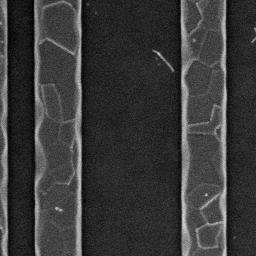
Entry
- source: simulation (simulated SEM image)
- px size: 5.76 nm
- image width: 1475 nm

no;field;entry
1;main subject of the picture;wiring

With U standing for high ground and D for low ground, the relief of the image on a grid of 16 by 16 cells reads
DDUUUDDDDDDUUUDD
DDUUUDDDDDDUUUDD
DDUUUDDDDDDUUUDD
DDUUUDDDDDDDUUDD
DDUUUDDDDDDUUUDD
DDUUUDDDDDDUUUDD
DDUUUDDDDDDDUUDD
DDUUUDDDDDDDUUDD
DDUUUDDDDDDDUUDD
DDUUUDDDDDDDUUDD
DDDUUDDDDDDDUUDD
DDUUUDDDDDDUUUDD
DDUUUDDDDDDUUUDD
DDUUUDDDDDDUUUDD
DDUUUDDDDDDDUUDD
DDUUUDDDDDDDUUDD